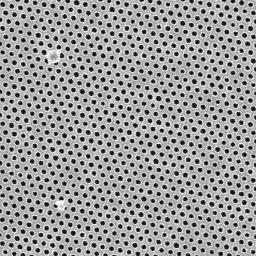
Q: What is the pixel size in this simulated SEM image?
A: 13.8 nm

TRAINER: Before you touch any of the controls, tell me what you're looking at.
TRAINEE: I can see a regular array of holes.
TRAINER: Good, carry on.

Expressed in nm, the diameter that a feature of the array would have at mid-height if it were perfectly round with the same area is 67.6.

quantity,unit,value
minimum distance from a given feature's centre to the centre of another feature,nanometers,121